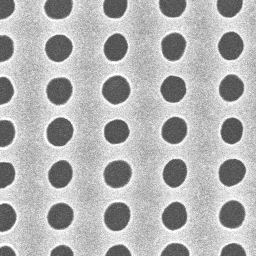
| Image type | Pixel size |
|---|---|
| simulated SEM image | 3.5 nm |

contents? a regular array of holes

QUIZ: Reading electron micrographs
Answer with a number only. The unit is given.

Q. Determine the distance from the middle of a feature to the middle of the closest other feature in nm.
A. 146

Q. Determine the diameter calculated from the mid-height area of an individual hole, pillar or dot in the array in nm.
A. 91.4